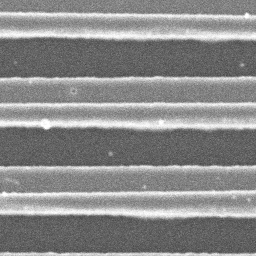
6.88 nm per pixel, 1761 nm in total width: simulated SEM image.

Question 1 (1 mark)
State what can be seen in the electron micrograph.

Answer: lines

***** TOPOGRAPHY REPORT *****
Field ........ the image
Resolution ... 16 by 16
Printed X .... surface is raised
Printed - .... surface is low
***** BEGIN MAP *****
XXXXXXXXXXXXXXXX
XXXXXXXXXXXXXXXX
----------------
----------------
----------------
XXXXXXXXXXXXXXXX
XXXXXXXXXXXXXXXX
XXXXXXXXXXXXXXXX
----------------
----------------
XXXXXXXXXXXXXXXX
XXXXXXXXXXXXXXXX
XXXXXXXXXXXXXXXX
----------------
----------------
----------------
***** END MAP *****